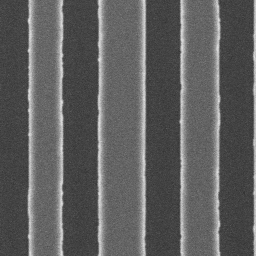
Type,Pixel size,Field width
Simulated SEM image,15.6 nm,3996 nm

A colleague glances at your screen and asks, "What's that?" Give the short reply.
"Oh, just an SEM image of lines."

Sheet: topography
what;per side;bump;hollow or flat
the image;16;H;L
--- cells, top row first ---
LLHHLLHHHLLHHHLL
LLHHLLHHHLLHHHLL
LLHHLLHHHLLHHHLL
LLHHLLHHHLLHHHLL
LLHHLLHHHLLHHHLL
LLHHLLHHHLLHHHLL
LLHHLLHHHLLHHHLL
LLHHLLHHHLLHHHLL
LLHHLLHHHLLHHHLL
LLHHLLHHHLLHHHLL
LLHHLLHHHLLHHHLL
LLHHLLHHHLLHHHLL
LLHHLLHHHLLHHHLL
LLHHLLHHHLLHHHLL
LLHHLLHHHLLHHHLL
LLHHLLHHHLLHHHLL